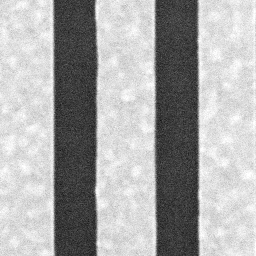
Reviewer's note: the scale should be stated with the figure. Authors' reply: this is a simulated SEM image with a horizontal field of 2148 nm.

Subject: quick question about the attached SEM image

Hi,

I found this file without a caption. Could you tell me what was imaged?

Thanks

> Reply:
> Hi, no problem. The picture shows one or a few lines or trenches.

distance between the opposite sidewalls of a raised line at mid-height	56.6	pixels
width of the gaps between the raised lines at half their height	373	nanometres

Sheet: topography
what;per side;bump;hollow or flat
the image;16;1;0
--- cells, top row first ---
1110001111001111
1110001111001111
1110001111001111
1110001111001111
1110001111001111
1110001111001111
1110001111001111
1110001111001111
1110001111001111
1110001111000111
1110001111000111
1110001111000111
1110001111000111
1110001111000111
1110001111000111
1110001111000111